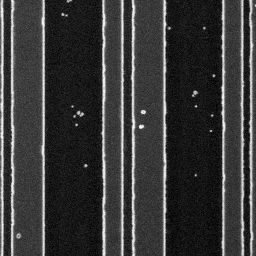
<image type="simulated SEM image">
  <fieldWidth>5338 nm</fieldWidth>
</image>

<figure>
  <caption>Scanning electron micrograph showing lines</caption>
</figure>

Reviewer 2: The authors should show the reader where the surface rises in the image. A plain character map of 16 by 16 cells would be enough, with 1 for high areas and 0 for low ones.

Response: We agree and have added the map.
1110001111000011
1110001111000011
1110001111000011
1110001111000011
1110001111000011
1110001111000011
1110001111000011
1110001111000011
1110001111000011
1110001111000011
1110001111000011
1110001111000011
1110001111000011
1110001111000011
1110001111000011
1110001111000011